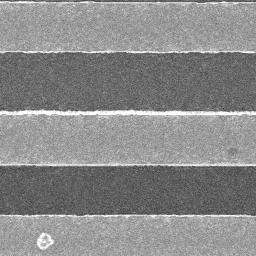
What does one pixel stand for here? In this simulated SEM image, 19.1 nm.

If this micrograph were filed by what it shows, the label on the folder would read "lines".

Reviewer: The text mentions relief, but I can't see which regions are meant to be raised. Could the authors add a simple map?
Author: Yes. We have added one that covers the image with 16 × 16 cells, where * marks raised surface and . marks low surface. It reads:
****************
****************
****************
................
................
................
................
****************
****************
****************
................
................
................
****************
****************
****************